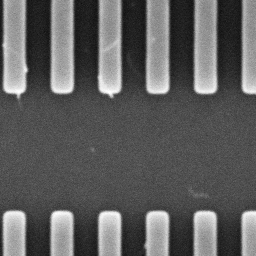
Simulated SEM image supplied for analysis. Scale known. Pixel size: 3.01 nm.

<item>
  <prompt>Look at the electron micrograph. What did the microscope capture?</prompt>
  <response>groups of lines, slits or small figures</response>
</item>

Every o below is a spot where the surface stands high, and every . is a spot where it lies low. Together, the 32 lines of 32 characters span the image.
ooo....oo....oo...ooo...ooo...oo
ooo....oo....oo...ooo...ooo...oo
ooo....oo....oo...ooo...ooo...oo
ooo...ooo....oo...ooo...ooo...oo
ooo....oo....oo...ooo...ooo...oo
ooo....oo....oo...ooo...ooo...oo
.oo....oo....oo...ooo...ooo...oo
.oo....oo....oo...ooo...ooo...oo
.oo...ooo....oo...ooo...ooo...oo
.oo...ooo...ooo...ooo...ooo...oo
.oo...ooo....oo...ooo...ooo...oo
..o..........o.....o.....o.....o
................................
................................
................................
................................
................................
................................
................................
................................
................................
................................
................................
................................
................................
................................
................................
ooo....oo....oo...ooo...ooo...oo
ooo...ooo...ooo...ooo...ooo...oo
ooo...ooo...ooo...ooo...ooo...oo
ooo...ooo...ooo...ooo...ooo...oo
ooo...ooo...ooo...ooo...ooo...oo